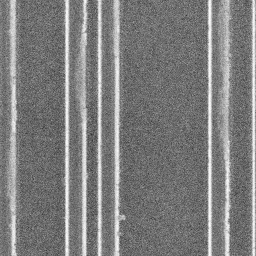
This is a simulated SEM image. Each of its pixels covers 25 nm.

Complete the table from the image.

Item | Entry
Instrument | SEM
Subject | lines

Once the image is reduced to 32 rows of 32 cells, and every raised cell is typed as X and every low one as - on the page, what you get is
XX------XXX--X------------XX----
XX------XXX--X------------XX----
XX------XX---X------------XX----
XX------XX---X------------XX----
XX------XX---X------------XX----
XX------XX---X------------XX----
XX------XX---XX-----------XX----
XX------XX---XX-----------XX----
XX------XX---XX-----------XX----
XX------XX---XX-----------XX----
XX------XX---XX-----------XX----
XX------XX---XX-----------XX----
XX------XX---XX-----------XX----
XX------XX---XX-----------XX----
XX------XX---XX-----------XX----
XX------XX---XX-----------XX----
XX------XX---XX-----------XX----
XX------XX---XX-----------XX----
XX------XX---XX-----------XX----
XX------XX---XX-----------XX----
XX------XX---XX-----------XX----
XX------XX---XX-----------XX----
XX------XX---XX-----------XX----
XX------XX---XX-----------XX----
XX------XX---XX-----------XX----
XX------XX---XX-----------XX----
XX------XX---XX-----------XX----
XX------XX---XX-----------XX----
XX------XX---XX-----------XX----
XX------XX---XX-----------XX----
XX------XX---XX-----------XX----
XX------XX---XX-----------XX----